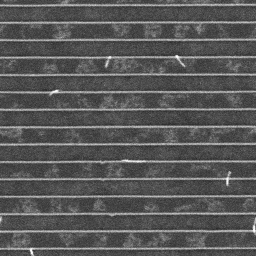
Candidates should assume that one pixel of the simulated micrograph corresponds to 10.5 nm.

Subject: parallel lines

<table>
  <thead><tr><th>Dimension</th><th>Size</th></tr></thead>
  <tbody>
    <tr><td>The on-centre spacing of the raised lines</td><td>366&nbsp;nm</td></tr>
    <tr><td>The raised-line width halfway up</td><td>185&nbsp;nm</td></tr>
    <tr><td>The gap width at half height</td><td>185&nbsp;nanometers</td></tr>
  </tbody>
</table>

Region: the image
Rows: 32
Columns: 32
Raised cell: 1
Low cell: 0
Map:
11111111111111111111111111111111
00000000000000000000000000000000
00000000000000000000000000000000
11111111111111111111111111111111
11111111111111111111111111111111
00000000000000000000000000000000
00000000000000000000000000000000
11111111111111111111111111111111
11111111111111111111111111111111
00000000000000000000000000000000
00000000000000000000000000000000
00000011000000000000000111111111
11111111111111111111111111111111
11111111111111111111111111111111
00000000000000000000000000000000
00000000000000000000000000000000
11111111111111111111111111111111
11111111111111111111111111111111
00000000000000000000000000000000
00000000000000000000000000000000
11111111111111111111111111111111
11111111111111111111111111111111
00000000000000000000000000000000
00000000000000000000000000000000
00000000000000000000000000000000
11111111111111111111111111111111
11111111111111111111111111111111
00000000000000000000000000000000
00000000000000000000000000000000
11111111111111111111111111111111
11111111111111111111111111111111
00000000000000000000000000000000